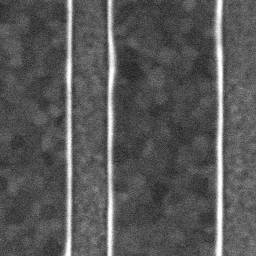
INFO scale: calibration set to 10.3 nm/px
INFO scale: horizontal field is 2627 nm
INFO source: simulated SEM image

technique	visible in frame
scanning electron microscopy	wiring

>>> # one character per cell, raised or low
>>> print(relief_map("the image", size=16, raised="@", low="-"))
@@@@---@@@@@@@--
@@@@---@@@@@@@--
@@@@---@@@@@@@--
@@@@---@@@@@@@--
@@@@---@@@@@@@--
@@@@---@@@@@@@--
@@@@---@@@@@@@--
@@@@---@@@@@@@--
@@@@---@@@@@@@--
@@@@---@@@@@@@--
@@@@---@@@@@@@--
@@@@---@@@@@@@--
@@@@---@@@@@@@--
@@@@---@@@@@@@--
@@@@---@@@@@@@--
@@@@---@@@@@@@--